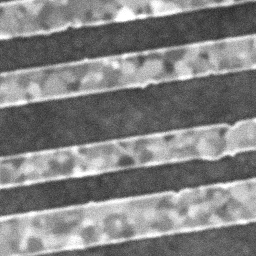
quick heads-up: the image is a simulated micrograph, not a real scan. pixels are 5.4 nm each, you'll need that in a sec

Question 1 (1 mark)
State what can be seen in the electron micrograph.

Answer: one or a few lines or trenches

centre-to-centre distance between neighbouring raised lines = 73.6 px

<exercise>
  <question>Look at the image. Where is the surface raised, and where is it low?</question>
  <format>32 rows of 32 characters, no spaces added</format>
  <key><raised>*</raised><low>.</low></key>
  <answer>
*****************************...
**********************..........
***************.................
********........................
**.............................*
.........................*******
..................**************
............********************
.....***************************
*************************.......
******************..............
************....................
*****...........................
................................
................................
..............................**
.....................***********
...............*****************
.........***********************
..**************************....
********************............
*************...................
******..........................
.........................*******
..................**************
...........*********************
.....***************************
********************************
**************************......
*******************.............
*************...................
******..........................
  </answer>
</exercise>